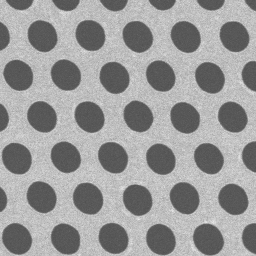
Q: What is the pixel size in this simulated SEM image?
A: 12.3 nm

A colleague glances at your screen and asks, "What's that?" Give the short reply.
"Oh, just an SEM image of a regular array of holes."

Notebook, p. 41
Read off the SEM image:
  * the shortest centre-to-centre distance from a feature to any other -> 0.566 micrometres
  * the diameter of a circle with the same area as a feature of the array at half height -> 378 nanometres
